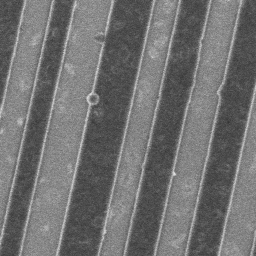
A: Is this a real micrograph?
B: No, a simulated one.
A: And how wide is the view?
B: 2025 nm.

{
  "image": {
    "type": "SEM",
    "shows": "one or a few lines or trenches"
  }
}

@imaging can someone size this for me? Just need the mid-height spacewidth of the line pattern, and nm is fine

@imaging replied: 230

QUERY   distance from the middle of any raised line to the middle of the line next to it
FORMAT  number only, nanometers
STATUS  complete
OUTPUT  500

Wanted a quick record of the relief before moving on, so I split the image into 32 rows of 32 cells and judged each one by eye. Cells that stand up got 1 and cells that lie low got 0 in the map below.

11100011100000111110001111000011
11100011100000111110001111000011
11100011100000111110001111000011
11000011100001111110001111000111
11000011100011111100011110000111
11000111000001111100011110000111
11000111000001111100011110000111
11000111000011111100011110001111
10000111000011111000011110001111
10001110000011111000111100001111
10001110000011111000111100001111
10001110000111111000111100011111
10001110000111111000111100011111
00001110000111110001111000011110
00011100000111110001111000011110
00011100000111110001111000011110
00011100001111110001111000011110
00011100001111100001111000111110
00011000001111100011110000111100
00111000001111100011110000111100
00111000001111100011110000111100
00111000011111100011110001111100
00111000011111000011100001111000
01110000011111000111100001111000
01110000011111000111100001111000
01110000111111000111100001111000
01110000111111000111100011111000
01100000111110001111000011110000
11100000111110001111000011110000
11100000111110001111000011110000
11100001111110001111000111110000
11100001111100001110000111100001